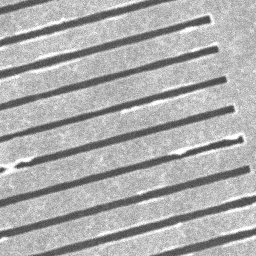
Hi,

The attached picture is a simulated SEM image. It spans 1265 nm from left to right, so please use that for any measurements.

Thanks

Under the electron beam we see parallel lines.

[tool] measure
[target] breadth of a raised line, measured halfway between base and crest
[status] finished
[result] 0.114 um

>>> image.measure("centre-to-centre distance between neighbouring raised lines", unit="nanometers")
153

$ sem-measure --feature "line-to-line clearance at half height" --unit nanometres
42.4